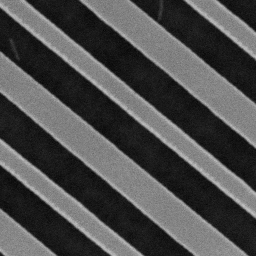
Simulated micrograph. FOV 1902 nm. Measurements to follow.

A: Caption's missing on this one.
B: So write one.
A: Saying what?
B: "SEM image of lines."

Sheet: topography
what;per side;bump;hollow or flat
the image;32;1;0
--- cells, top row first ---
11110000000111111000000011110000
01111000000011111100000001111000
00111100000001111110000000111100
00011110000000111111000000011110
00001111000000011111110000000111
00000011110000001111111000000011
00000001111000000011111100000001
10000000111100000001111110000000
11100000011110000000111111000000
11110000000111000000011111110000
11111000000011110000001111111000
11111100000001111000000011111100
01111110000000111100000001111110
00111111100000011110000000111111
00001111110000001111000000011111
00000111111000000011110000001111
00000011111100000001111000000011
00000001111110000000111100000001
10000000111111100000011110000000
11100000001111110000001111000000
11110000000111111000000011110000
01111000000011111100000001111000
00111100000001111110000000111100
00001111000000111111100000011110
00000111100000011111110000000111
00000011110000000111111000000011
00000001111000000011111100000001
11000000111100000001111110000000
11100000001111000000111111100000
11110000000111100000011111110000
11111000000011110000001111111000
11111100000001111000000011111100